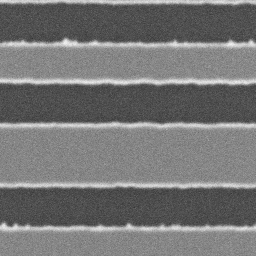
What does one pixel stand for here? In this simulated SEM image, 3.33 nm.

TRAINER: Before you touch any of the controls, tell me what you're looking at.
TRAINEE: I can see lines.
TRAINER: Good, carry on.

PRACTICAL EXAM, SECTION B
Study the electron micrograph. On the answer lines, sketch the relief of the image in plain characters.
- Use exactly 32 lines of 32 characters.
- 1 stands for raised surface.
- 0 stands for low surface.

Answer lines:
00000000000000000000000000000000
00000000000000000000000000000000
00000000000000000000000000000000
00000000000000000000000000000000
00000000000000000000000000000000
01011111000111001100010000000010
11111111111111111111111111111111
11111111111111111111111111111111
11111111111111111111111111111111
11111111111111111111111111111111
00000000001100110001100001101110
00000000000000000000000000000000
00000000000000000000000000000000
00000000000000000000000000000000
00000000000000000000000000000000
00000000000001100110000000000000
11111111111111111111111111111111
11111111111111111111111111111111
11111111111111111111111111111111
11111111111111111111111111111111
11111111111111111111111111111111
11111111111111111111111111111111
11111111111111111111111111111111
00000000000000000000000000000000
00000000000000000000000000000000
00000000000000000000000000000000
00000000000000000000000000000000
00000000000000000000000000000000
11111111111111111111111111111111
11111111111111111111111111111111
11111111111111111111111111111111
11111111111111111111111111111111